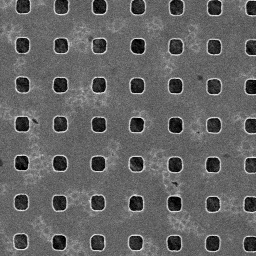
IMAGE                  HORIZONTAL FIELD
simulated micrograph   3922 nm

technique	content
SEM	a regular array of holes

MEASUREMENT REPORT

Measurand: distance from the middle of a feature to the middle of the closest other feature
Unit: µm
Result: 0.586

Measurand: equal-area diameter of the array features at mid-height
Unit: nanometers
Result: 240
